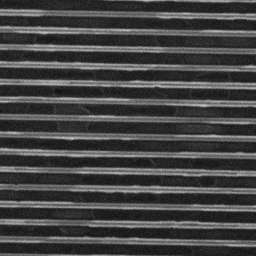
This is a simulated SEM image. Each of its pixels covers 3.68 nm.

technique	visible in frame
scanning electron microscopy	parallel lines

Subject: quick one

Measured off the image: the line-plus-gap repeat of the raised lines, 0.0642 microns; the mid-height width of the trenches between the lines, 41.9 nanometers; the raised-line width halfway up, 20.7 nm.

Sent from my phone